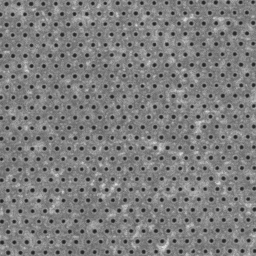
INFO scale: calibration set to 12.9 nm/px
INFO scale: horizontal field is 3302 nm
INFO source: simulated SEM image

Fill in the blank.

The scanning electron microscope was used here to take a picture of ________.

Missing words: a regular array of holes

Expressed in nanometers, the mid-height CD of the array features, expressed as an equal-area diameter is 54.5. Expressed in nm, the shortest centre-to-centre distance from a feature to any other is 150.